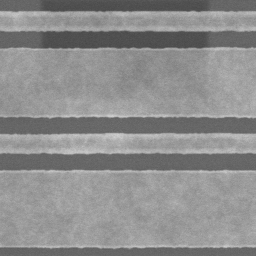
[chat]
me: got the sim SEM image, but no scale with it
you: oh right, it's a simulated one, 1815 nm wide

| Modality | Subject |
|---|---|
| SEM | lines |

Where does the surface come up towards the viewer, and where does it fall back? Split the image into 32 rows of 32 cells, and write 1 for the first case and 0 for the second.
00000000000000000000000000000000
00000000000000000000000000000000
11111111111111111111111111111111
11111111111111111111111111111111
00000000000000000000000000000000
00000000000000000000000000000000
11111111111111111111111111111111
11111111111111111111111111111111
11111111111111111111111111111111
11111111111111111111111111111111
11111111111111111111111111111111
11111111111111111111111111111111
11111111111111111111111111111111
11111111111111111111111111111111
11111111111111111111111111111111
00000000000000000000000000000000
00000000000000000000000000000000
11111111111111111111111111111111
11111111111111111111111111111111
00000000000000000000000000000000
00000000000000000000000000000000
11111111111111111111111111111111
11111111111111111111111111111111
11111111111111111111111111111111
11111111111111111111111111111111
11111111111111111111111111111111
11111111111111111111111111111111
11111111111111111111111111111111
11111111111111111111111111111111
11111111111111111111111111111111
11111111111111111111111111111111
00000000000000000000000000000000